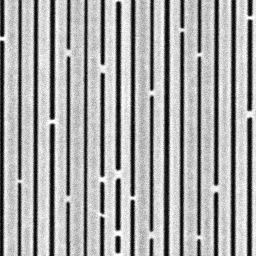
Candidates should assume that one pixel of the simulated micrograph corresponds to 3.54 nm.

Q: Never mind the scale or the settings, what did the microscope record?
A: parallel lines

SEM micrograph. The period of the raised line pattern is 16.4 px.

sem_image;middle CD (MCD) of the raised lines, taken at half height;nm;41.5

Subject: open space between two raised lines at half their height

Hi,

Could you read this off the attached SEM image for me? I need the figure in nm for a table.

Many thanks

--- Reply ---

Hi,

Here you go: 14.1